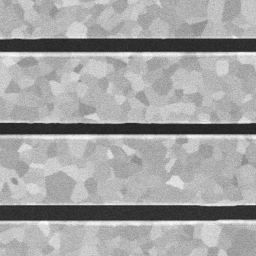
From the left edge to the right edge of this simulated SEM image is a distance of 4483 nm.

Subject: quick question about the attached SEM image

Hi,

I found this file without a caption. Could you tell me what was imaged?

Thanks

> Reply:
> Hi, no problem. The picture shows lines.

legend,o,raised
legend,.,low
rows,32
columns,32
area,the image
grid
oooooooooooooooooooooooooooooooo
oooooooooooooooooooooooooooooooo
oooooooooooooooooooooooooooooooo
oooooooooooooooooooooooooooooooo
oooooooooooooooooooooooooooooooo
................................
................................
oooooooooooooooooooooooooooooooo
oooooooooooooooooooooooooooooooo
oooooooooooooooooooooooooooooooo
oooooooooooooooooooooooooooooooo
oooooooooooooooooooooooooooooooo
oooooooooooooooooooooooooooooooo
oooooooooooooooooooooooooooooooo
oooooooooooooooooooooooooooooooo
................................
................................
oooooooooooooooooooooooooooooooo
oooooooooooooooooooooooooooooooo
oooooooooooooooooooooooooooooooo
oooooooooooooooooooooooooooooooo
oooooooooooooooooooooooooooooooo
oooooooooooooooooooooooooooooooo
oooooooooooooooooooooooooooooooo
oooooooooooooooooooooooooooooooo
oooooooooooooooooooooooooooooooo
................................
................................
oooooooooooooooooooooooooooooooo
oooooooooooooooooooooooooooooooo
oooooooooooooooooooooooooooooooo
oooooooooooooooooooooooooooooooo